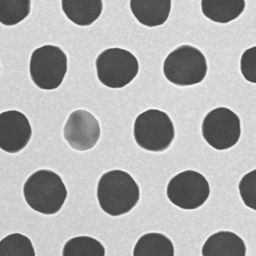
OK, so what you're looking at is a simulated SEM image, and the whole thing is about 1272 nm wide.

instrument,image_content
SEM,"a regular array of holes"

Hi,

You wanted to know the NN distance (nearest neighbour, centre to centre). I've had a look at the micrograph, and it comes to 341 nanometres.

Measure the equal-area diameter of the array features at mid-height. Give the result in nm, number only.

202